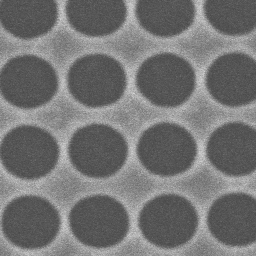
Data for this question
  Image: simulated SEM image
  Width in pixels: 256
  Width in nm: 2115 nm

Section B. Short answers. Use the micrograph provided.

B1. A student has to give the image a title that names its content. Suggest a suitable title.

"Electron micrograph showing holes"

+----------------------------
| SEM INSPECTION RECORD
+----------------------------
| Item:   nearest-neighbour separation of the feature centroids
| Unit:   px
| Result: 69.2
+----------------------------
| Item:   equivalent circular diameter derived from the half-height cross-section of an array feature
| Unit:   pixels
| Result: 58.5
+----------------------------